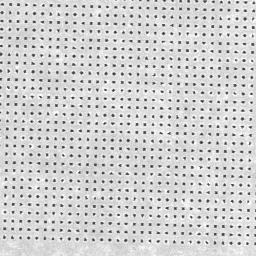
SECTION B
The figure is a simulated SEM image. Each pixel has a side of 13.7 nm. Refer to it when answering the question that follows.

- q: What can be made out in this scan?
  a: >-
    a regular array of holes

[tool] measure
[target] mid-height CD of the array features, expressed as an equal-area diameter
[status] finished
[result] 43.7 nm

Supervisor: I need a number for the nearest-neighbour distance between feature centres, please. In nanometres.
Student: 110